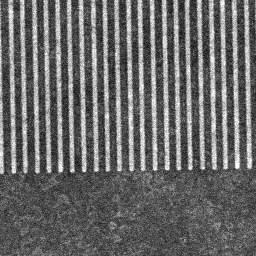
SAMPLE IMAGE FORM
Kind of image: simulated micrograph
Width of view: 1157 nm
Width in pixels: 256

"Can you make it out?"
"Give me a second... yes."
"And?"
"parallel lines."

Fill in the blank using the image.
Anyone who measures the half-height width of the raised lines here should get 0.0158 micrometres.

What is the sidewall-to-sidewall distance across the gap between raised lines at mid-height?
35.6 nm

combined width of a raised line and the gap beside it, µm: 0.0532